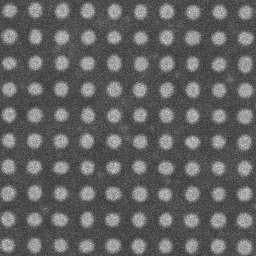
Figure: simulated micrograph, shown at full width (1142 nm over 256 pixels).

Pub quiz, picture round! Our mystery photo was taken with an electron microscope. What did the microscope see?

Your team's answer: a regular array of raised bodies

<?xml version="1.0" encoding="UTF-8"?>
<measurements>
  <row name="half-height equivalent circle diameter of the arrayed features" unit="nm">57.6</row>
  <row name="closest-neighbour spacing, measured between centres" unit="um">0.115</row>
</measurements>